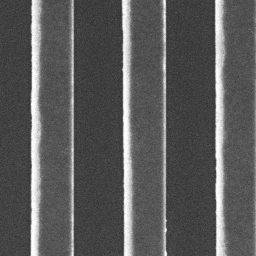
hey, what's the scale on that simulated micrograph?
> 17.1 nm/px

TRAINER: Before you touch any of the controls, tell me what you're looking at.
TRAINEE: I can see lines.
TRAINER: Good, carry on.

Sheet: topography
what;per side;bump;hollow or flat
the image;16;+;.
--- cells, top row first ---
..+++...++....++
..+++...++....++
..+++...++....++
..+++...++....++
..+++...++....++
..+++...++....++
..+++...++....++
..+++...++....++
..+++...++....++
..+++...++....++
..+++...++....++
..+++...++....++
..+++...++....++
..+++...++....++
..+++...++....++
..+++...++....++